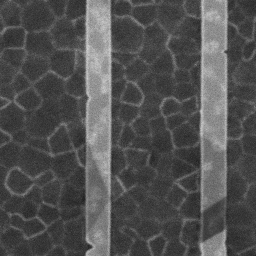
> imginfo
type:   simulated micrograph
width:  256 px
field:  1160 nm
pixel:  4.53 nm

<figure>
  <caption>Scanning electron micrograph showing one or a few lines or trenches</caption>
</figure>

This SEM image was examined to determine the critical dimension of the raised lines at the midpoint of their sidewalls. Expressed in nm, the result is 110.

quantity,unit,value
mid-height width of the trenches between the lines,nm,412